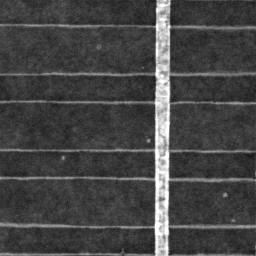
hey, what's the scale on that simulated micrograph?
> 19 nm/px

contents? wiring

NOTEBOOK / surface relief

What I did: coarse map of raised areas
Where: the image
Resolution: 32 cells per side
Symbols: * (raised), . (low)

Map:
....................*...........
....................*...........
....................*...........
*************************.......
********************************
********************************
********************************
********************************
********************************
...................**...........
....................*...........
....................*...........
...................**...........
********************************
********************************
********************************
********************************
********************************
********************************
....................*...........
....................*...........
....................*...........
*************************...****
********************************
********************************
********************************
********************************
********************************
...................**...........
....................*...........
....................*...........
...................**...........